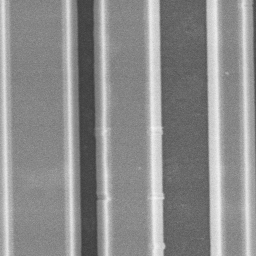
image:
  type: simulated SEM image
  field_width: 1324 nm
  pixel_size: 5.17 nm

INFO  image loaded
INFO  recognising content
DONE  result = one or a few lines or trenches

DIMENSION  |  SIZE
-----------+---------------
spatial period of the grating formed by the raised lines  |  0.511 um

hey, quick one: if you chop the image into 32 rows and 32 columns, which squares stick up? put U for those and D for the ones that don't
UUUUUUUUUDDDUUUUUUUDDDDDDDDUUUUD
UUUUUUUUUDDDUUUUUUUDDDDDDDDUUUUD
UUUUUUUUUDDDUUUUUUUDDDDDDDDUUUUD
UUUUUUUUUDDDUUUUUUUDDDDDDDDUUUUD
UUUUUUUUUDDDDUUUUUUDDDDDDDDUUUUD
UUUUUUUUUDDDDUUUUUUDDDDDDDDUUUUD
UUUUUUUUUDDDDUUUUUUDDDDDDDDUUUUD
UUUUUUUUUDDDDUUUUUUDDDDDDDDUUUUD
UUUUUUUUUDDDDUUUUUUDDDDDDDDUUUUD
UUUUUUUUUDDDDUUUUUUDDDDDDDDUUUUD
UUUUUUUUUDDDDUUUUUUDDDDDDDDUUUUD
UUUUUUUUUDDDDUUUUUUDDDDDDDDUUUUD
UUUUUUUUUDDDDUUUUUUDDDDDDDDUUUUD
UUUUUUUUUDDDDUUUUUUDDDDDDDDUUUUD
UUUUUUUUUDDDDUUUUUUDDDDDDDDUUUUD
UUUUUUUUUDDDDUUUUUUDDDDDDDDUUUUD
UUUUUUUUUDDDDUUUUUUDDDDDDDDUUUUD
UUUUUUUUUDDDDUUUUUUDDDDDDDDUUUUD
UUUUUUUUUDDDDUUUUUUDDDDDDDDUUUUD
UUUUUUUUUDDDDUUUUUUDDDDDDDDUUUUD
UUUUUUUUUDDDDUUUUUUDDDDDDDDUUUUD
UUUUUUUUUDDDDUUUUUUDDDDDDDDUUUUD
UUUUUUUUUDDDDUUUUUUDDDDDDDDUUUUD
UUUUUUUUUDDDDUUUUUUUDDDDDDDUUUUD
UUUUUUUUUDDDDUUUUUUUDDDDDDDUUUUD
UUUUUUUUUDDDDUUUUUUUDDDDDDDUUUUD
UUUUUUUUUDDDDUUUUUUUDDDDDDDUUUUD
DUUUUUUUUDDDDUUUUUUUDDDDDDDUUUUD
DUUUUUUUUDDDDUUUUUUUDDDDDDDUUUUD
DUUUUUUUUDDDDUUUUUUUDDDDDDDUUUUD
DUUUUUUUUDDDDUUUUUUUDDDDDDDUUUUD
DUUUUUUUUDDDDUUUUUUUDDDDDDDUUUUD